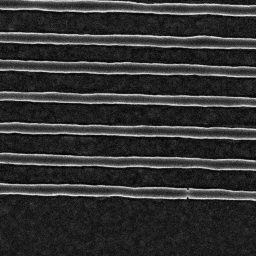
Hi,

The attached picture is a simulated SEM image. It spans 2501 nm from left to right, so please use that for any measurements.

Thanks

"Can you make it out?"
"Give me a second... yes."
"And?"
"parallel lines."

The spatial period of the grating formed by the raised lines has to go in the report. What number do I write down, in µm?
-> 0.299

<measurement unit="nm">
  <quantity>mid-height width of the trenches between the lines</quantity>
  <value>211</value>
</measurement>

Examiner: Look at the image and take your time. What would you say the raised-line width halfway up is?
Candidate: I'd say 97.1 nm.